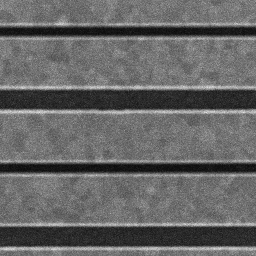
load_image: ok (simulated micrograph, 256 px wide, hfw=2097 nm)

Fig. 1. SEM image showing one or a few lines or trenches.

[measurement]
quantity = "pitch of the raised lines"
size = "560 nanometers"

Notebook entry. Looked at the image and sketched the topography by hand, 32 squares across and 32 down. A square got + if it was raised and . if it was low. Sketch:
++++++++++++++++++++++++++++++++
++++++++++++++++++++++++++++++++
++++++++++++++++++++++++++++++++
................................
................................
++++++++++++++++++++++++++++++++
++++++++++++++++++++++++++++++++
++++++++++++++++++++++++++++++++
++++++++++++++++++++++++++++++++
++++++++++++++++++++++++++++++++
++++++++++++++++++++++++++++++++
................................
................................
................................
++++++++++++++++++++++++++++++++
++++++++++++++++++++++++++++++++
++++++++++++++++++++++++++++++++
++++++++++++++++++++++++++++++++
++++++++++++++++++++++++++++++++
++++++++++++++++++++++++++++++++
................................
................................
++++++++++++++++++++++++++++++++
++++++++++++++++++++++++++++++++
++++++++++++++++++++++++++++++++
++++++++++++++++++++++++++++++++
++++++++++++++++++++++++++++++++
++++++++++++++++++++++++++++++++
................................
................................
................................
++++++++++++++++++++++++++++++++